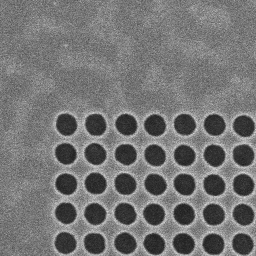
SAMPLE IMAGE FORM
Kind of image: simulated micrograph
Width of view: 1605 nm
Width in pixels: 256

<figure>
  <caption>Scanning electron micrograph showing a regular array of holes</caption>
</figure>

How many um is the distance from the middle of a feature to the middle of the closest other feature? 0.183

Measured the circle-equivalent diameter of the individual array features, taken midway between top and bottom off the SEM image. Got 138 nanometers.